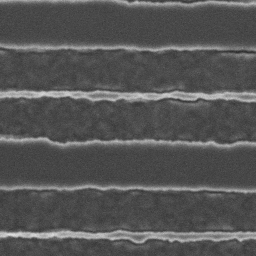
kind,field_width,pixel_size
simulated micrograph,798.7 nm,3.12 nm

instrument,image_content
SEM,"lines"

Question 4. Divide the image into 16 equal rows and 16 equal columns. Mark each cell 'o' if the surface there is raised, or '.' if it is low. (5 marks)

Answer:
oooooooooooooooo
oooooooooooooooo
oooooooooooooooo
................
................
................
................
................
................
oooooooooooooooo
oooooooooooooooo
oooooooooooooooo
................
................
................
................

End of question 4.